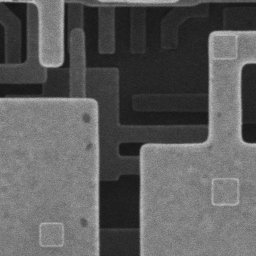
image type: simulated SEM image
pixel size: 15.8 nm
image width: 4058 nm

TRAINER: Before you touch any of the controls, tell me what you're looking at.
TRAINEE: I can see wiring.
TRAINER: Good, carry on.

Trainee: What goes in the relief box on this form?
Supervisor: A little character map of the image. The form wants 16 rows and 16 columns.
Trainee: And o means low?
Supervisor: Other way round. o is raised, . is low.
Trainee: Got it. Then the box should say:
..oo............
..oo............
..oo.........ooo
..oo.........ooo
.............oo.
.............oo.
oooooo.......oo.
oooooo.......oo.
oooooo.......oo.
oooooo...ooooooo
oooooo...ooooooo
oooooo...ooooooo
oooooo...ooooooo
oooooo...ooooooo
oooooo...ooooooo
oooooo...ooooooo